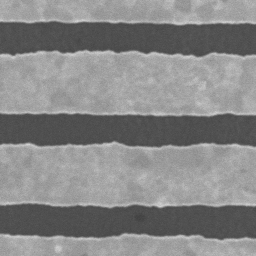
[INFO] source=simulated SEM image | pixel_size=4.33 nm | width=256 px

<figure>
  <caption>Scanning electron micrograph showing lines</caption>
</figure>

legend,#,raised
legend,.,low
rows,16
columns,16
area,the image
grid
################
...........#....
................
############.##.
################
################
################
................
................
################
################
################
################
................
................
################